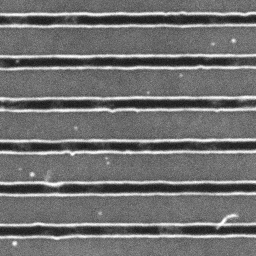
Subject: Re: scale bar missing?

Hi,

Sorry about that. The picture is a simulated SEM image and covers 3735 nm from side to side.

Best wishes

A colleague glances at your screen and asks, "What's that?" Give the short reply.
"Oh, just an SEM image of parallel lines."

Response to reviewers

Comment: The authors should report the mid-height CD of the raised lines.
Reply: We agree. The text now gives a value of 0.184 um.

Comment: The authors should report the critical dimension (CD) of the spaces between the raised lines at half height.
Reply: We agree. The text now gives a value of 0.423 micrometres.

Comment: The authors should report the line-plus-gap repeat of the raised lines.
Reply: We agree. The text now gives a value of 614 nanometers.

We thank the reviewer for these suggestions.